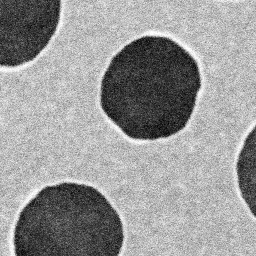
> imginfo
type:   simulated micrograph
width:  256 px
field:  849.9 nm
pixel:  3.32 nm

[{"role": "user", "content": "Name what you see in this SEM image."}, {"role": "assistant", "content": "holes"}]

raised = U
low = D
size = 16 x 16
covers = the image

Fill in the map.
DDDDUUUUUUUUUUUU
DDDDUUUUUUUUUUUU
DDDUUUUUDDDUUUUU
DDUUUUUDDDDDUUUU
UUUUUUUDDDDDUUUU
UUUUUUDDDDDDDUUU
UUUUUUDDDDDDUUUU
UUUUUUUDDDDDUUUU
UUUUUUUUDDDUUUUD
UUUUUUUUUUUUUUUD
UUUUUUUUUUUUUUUD
UUUUDUUUUUUUUUUD
UUDDDDDUUUUUUUUD
UDDDDDDUUUUUUUUU
UDDDDDDDUUUUUUUU
UDDDDDDDUUUUUUUU